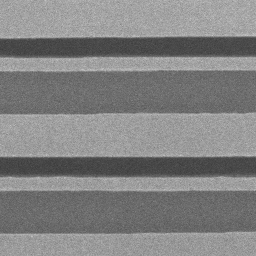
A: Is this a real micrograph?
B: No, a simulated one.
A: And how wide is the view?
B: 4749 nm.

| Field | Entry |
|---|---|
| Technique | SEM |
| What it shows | lines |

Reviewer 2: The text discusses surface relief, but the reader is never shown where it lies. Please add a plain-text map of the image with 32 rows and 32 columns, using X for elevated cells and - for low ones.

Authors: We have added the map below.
XXXXXXXXXXXXXXXXXXXXXXXXXXXXXXXX
XXXXXXXXXXXXXXXXXXXXXXXXXXXXXXXX
XXXXXXXXXXXXXXXXXXXXXXXXXXXXXXXX
XXXXXXXXXXXXXXXXXXXXXXXXXXXXXXXX
XXXXXXXXXXXXXXXXXXXXXX--X-XX----
--------------------------------
--------------------------------
XXXXXXXXXXXXXXXXXXXXXXXXXXXXXXXX
XXXXXXXXXXXXXXXXXXXXXXXXXXXXXXXX
--------------------------------
--------------------------------
--------------------------------
--------------------------------
--------------------------------
XXXXXXXXXXXXXXXXXXXXXXXXXXXXXXXX
XXXXXXXXXXXXXXXXXXXXXXXXXXXXXXXX
XXXXXXXXXXXXXXXXXXXXXXXXXXXXXXXX
XXXXXXXXXXXXXXXXXXXXXXXXXXXXXXXX
XXXXXXXXXXXXXXXXXXXXXXXXXXXXXXXX
XXXXXXXXXXXXXXXXXXXXXXXXXXXXXXXX
--------------------------------
--------------------------------
XXXXXXXXXXXXXXXXXXXXXXXXXXXXXXXX
XXXXXXXXXXXXXXXXXXXXXXXXXXXXXXXX
--------------------------------
--------------------------------
--------------------------------
--------------------------------
--------------------------------
XXXXXXXXXXXXXXXXXXXXXXXXXXXXXXXX
XXXXXXXXXXXXXXXXXXXXXXXXXXXXXXXX
XXXXXXXXXXXXXXXXXXXXXXXXXXXXXXXX